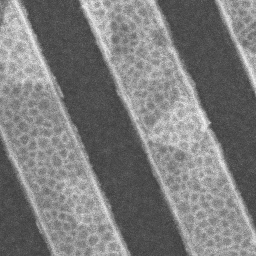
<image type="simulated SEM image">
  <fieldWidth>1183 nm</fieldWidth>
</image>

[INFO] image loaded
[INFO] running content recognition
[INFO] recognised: one or a few lines or trenches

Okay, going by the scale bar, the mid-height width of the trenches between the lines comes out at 286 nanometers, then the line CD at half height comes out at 291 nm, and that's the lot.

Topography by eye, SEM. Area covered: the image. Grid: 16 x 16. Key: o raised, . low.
o....ooooo....oo
oo....oooo....oo
oo....ooooo....o
oo.....oooo....o
ooo....oooo.....
ooo.....oooo....
oooo....oooo....
oooo....ooooo...
ooooo....oooo...
.oooo....ooooo..
.ooooo....oooo..
..oooo....oooo..
..oooo.....oooo.
..ooooo....oooo.
...oooo....ooooo
...ooooo....oooo